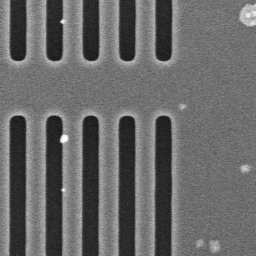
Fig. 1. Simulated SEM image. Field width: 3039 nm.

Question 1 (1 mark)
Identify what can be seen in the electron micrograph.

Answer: groups of lines, slits or small figures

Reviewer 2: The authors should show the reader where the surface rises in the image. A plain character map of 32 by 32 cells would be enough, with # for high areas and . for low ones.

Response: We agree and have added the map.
#..###..##..###..##...##########
#..###..##..###..##...##########
#..###..##..###..##...##########
#..###..##..###..##...##########
#..###..##..###..##...##########
#..###..##..###..##...##########
#..###..##..###..##...##########
##.###.####.###.####.###########
################################
################################
################################
################################
################################
################################
################################
#..###..##..###..##..###########
#..###..##..###..##...##########
#..###..##..###..##...##########
#..###..##..###..##...##########
#..###..##..###..##...##########
#..###..##..###..##...##########
#..###..##..###..##...##########
#..###..##..###..##...##########
#..###..##..###..##...##########
#..###..##..###..##...##########
#..###..##..###..##...##########
#..###..##..###..##...##########
#..###..##..###..##...##########
#..###..##..###..##...##########
#..###..##..###..##..###########
#..###..##..###..##...##########
#..###..##..###..##...##########